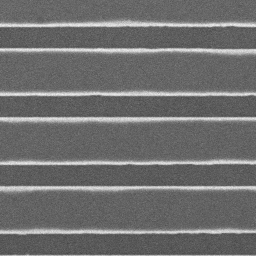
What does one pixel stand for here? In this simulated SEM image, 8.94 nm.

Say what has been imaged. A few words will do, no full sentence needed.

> lines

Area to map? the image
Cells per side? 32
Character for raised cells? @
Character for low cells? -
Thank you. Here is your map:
@@@@@@@@@@@@@@@@@@@@@@@@@@@@@@@@
@@@@@@@@@@@@@@@@@@@@@@@@@@@@@@@@
@@@@@@@@@@@@@@@@@@@@@@@@@@@@@@@@
--------------------------------
--------------------------------
--------------------------------
@@@@@@@@@@@@@@@@@@@@@@@@@@@@@@@@
@@@@@@@@@@@@@@@@@@@@@@@@@@@@@@@@
@@@@@@@@@@@@@@@@@@@@@@@@@@@@@@@@
@@@@@@@@@@@@@@@@@@@@@@@@@@@@@@@@
@@@@@@@@@@@@@@@@@@@@@@@@@@@@@@@@
@@@@@@@@@@@@@@@@@@@@@@@@@@@@@@@@
--------------------------------
--------------------------------
--------------------------------
@@@@@@@@@@@@@@@@@@@@@@@@@@@@@@@@
@@@@@@@@@@@@@@@@@@@@@@@@@@@@@@@@
@@@@@@@@@@@@@@@@@@@@@@@@@@@@@@@@
@@@@@@@@@@@@@@@@@@@@@@@@@@@@@@@@
@@@@@@@@@@@@@@@@@@@@@@@@@@@@@@@@
--------------------------------
--------------------------------
--------------------------------
---@@@@@@@@@--@@@@@@@@@@@@@@@@@@
@@@@@@@@@@@@@@@@@@@@@@@@@@@@@@@@
@@@@@@@@@@@@@@@@@@@@@@@@@@@@@@@@
@@@@@@@@@@@@@@@@@@@@@@@@@@@@@@@@
@@@@@@@@@@@@@@@@@@@@@@@@@@@@@@@@
@@@@@@@@@@@@@@@@@@@@@@@@@@@@@@@@
--------------------------------
--------------------------------
--------------------------------